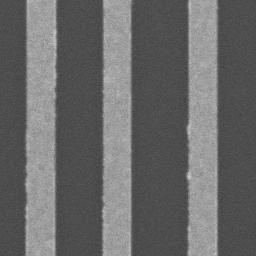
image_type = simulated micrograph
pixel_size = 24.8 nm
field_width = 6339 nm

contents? lines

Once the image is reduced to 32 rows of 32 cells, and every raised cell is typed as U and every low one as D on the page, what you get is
DDDUUUUDDDDDDUUUDDDDDDDDUUUDDDDD
DDDUUUUDDDDDDUUUDDDDDDDDUUUDDDDD
DDDUUUUDDDDDDUUUDDDDDDDDUUUDDDDD
DDDUUUUDDDDDDUUUDDDDDDDDUUUDDDDD
DDDUUUUDDDDDDUUUDDDDDDDDUUUDDDDD
DDDUUUUDDDDDDUUUDDDDDDDDUUUDDDDD
DDDUUUUDDDDDDUUUDDDDDDDDUUUDDDDD
DDDUUUUDDDDDDUUUDDDDDDDDUUUDDDDD
DDDUUUUDDDDDDUUUDDDDDDDDUUUDDDDD
DDDUUUUDDDDDDUUUDDDDDDDDUUUDDDDD
DDDUUUUDDDDDDUUUDDDDDDDDUUUDDDDD
DDDUUUUDDDDDDUUUDDDDDDDDUUUDDDDD
DDDUUUUDDDDDDUUUDDDDDDDDUUUDDDDD
DDDUUUUDDDDDDUUUDDDDDDDDUUUDDDDD
DDDUUUUDDDDDDUUUDDDDDDDDUUUDDDDD
DDDUUUUDDDDDDUUUDDDDDDDDUUUDDDDD
DDDUUUUDDDDDDUUUDDDDDDDDUUUDDDDD
DDDUUUUDDDDDDUUUDDDDDDDDUUUDDDDD
DDDUUUUDDDDDDUUUDDDDDDDDUUUDDDDD
DDDUUUUDDDDDDUUUDDDDDDDDUUUDDDDD
DDDUUUUDDDDDDUUUDDDDDDDDUUUDDDDD
DDDUUUUDDDDDDUUUDDDDDDDDUUUDDDDD
DDDUUUUDDDDDDUUUDDDDDDDDUUUDDDDD
DDDUUUUDDDDDDUUUDDDDDDDDUUUDDDDD
DDDUUUUDDDDDDUUUDDDDDDDDUUUDDDDD
DDDUUUUDDDDDDUUUDDDDDDDDUUUDDDDD
DDDUUUUDDDDDDUUUDDDDDDDDUUUDDDDD
DDDUUUUDDDDDDUUUDDDDDDDDUUUDDDDD
DDDUUUUDDDDDDUUUDDDDDDDDUUUDDDDD
DDDUUUUDDDDDDUUUDDDDDDDDUUUDDDDD
DDDUUUUDDDDDDUUUDDDDDDDDUUUDDDDD
DDDUUUUDDDDDDUUUDDDDDDDDUUUDDDDD